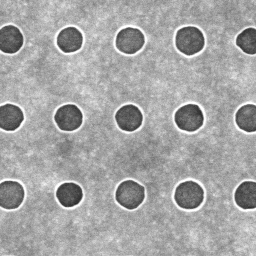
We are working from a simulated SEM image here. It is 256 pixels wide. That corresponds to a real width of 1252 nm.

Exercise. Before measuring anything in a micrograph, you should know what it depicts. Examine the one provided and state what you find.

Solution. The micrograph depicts a regular array of holes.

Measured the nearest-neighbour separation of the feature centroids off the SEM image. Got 294 nanometres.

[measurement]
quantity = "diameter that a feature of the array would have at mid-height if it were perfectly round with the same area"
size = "143 nanometres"